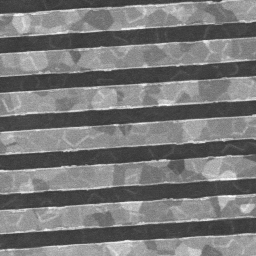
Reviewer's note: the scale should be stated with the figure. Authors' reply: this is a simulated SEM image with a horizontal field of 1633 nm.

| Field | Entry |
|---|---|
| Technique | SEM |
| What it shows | parallel lines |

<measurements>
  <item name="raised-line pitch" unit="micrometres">0.249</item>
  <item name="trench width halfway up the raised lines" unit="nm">102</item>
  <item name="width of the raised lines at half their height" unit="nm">146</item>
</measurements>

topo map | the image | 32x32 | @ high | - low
---------------------@@@@@@@@@@@
------@@@@@@@@@@@@@@@@@@@@@@@@@@
@@@@@@@@@@@@@@@@@@@@@@@@@@@@@@@@
@@@@@@@@@@@@@@@@@@--------------
@@@-----------------------------
--------------------@@@@@@@@@@@@
----@@@@@@@@@@@@@@@@@@@@@@@@@@@@
@@@@@@@@@@@@@@@@@@@@@@@@@@@@@@@@
@@@@@@@@@@@@@@@@@---------------
@-------------------------------
------------------@@@@@@@@@@@@@@
--@@@@@@@@@@@@@@@@@@@@@@@@@@@@@@
@@@@@@@@@@@@@@@@@@@@@@@@@@@@@@--
@@@@@@@@@@@@@@@-----------------
-------------------------------@
----------------@@@@@@@@@@@@@@@@
-@@@@@@@@@@@@@@@@@@@@@@@@@@@@@@@
@@@@@@@@@@@@@@@@@@@@@@@@@@@@@---
@@@@@@@@@@@@@-------------------
----------------------------@-@@
--------------@@@@@@@@@@@@@@@@@@
@@@@@@@@@@@@@@@@@@@@@@@@@@@@@@@@
@@@@@@@@@@@@@@@@@@@@@@@@@@@-----
@@@@@@@@@@@@@-------------------
----------------------------@-@@
------------@@@@@@@@@@@@@@@@@@@@
@@@@@@@@@@@@@@@@@@@@@@@@@@@@@@@@
@@@@@@@@@@@@@@@@@@@@@@@@@@------
@@@@@@@@@@----------------------
----------------------------@@@@
------------@@@@@@@@@@@@@@@@@@@@
@@@@@@@@@@@@@@@@@@@@@@@@@@@@@@@@